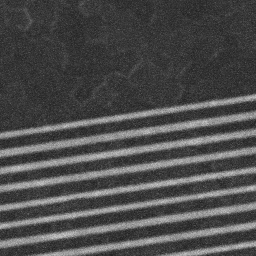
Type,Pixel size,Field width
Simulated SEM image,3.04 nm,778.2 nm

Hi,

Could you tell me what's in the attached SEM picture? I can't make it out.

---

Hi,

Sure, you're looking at parallel lines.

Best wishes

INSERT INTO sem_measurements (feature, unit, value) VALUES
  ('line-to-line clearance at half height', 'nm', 39.1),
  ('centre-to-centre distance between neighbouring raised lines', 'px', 18.1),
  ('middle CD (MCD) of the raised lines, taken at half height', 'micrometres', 0.018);